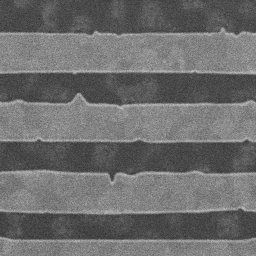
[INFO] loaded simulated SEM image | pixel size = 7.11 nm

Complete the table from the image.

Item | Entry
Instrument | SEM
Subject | one or a few lines or trenches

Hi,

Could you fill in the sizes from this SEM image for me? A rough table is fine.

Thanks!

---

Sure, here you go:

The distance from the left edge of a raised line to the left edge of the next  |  497 nm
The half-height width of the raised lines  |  270 nanometers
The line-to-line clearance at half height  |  223 nanometres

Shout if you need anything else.